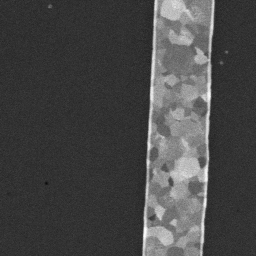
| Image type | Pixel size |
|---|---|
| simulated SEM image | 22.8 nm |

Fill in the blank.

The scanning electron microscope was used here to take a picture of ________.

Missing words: one or a few lines or trenches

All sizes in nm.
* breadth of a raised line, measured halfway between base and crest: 1320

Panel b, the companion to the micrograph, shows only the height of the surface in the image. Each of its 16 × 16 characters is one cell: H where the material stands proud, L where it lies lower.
LLLLLLLLLLHHHLLL
LLLLLLLLLLHHHLLL
LLLLLLLLLLHHHLLL
LLLLLLLLLLHHHLLL
LLLLLLLLLLHHHLLL
LLLLLLLLLHHHHLLL
LLLLLLLLLHHHHLLL
LLLLLLLLLHHHHLLL
LLLLLLLLLHHHHLLL
LLLLLLLLLHHHHLLL
LLLLLLLLLHHHHLLL
LLLLLLLLLHHHHLLL
LLLLLLLLLHHHHLLL
LLLLLLLLLHHHHLLL
LLLLLLLLLHHHHLLL
LLLLLLLLLHHHHLLL